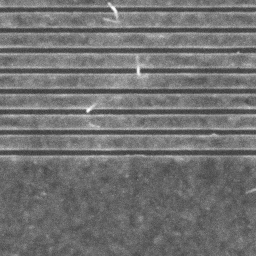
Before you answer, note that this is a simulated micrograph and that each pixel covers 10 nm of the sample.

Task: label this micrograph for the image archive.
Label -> parallel lines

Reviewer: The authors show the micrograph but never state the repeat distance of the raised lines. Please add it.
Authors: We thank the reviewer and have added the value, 203 nanometres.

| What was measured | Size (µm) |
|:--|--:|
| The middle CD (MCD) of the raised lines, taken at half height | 0.141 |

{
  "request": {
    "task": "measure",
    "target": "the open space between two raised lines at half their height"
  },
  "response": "56.4 nanometers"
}